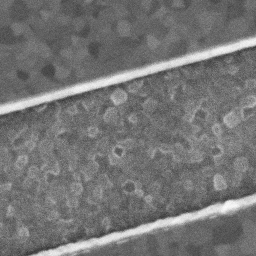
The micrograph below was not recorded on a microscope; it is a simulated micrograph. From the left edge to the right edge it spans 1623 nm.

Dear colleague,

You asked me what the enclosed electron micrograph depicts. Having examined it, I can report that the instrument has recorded one or a few lines or trenches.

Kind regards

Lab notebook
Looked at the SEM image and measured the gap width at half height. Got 965 nm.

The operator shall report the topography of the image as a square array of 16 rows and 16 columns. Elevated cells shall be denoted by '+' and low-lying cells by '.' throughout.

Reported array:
++++++++++++++++
++++++++++++++++
++++++++++++++++
+++++++++++++...
+++++++++.......
+++++...........
++..............
................
................
................
................
................
................
............++++
........++++++++
....++++++++++++